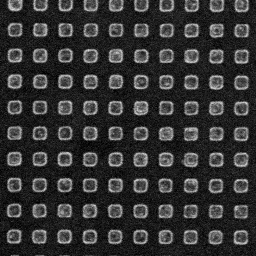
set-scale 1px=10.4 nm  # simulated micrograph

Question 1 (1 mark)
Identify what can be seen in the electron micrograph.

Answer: a regular array of raised bodies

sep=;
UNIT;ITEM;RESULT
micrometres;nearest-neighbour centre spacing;0.26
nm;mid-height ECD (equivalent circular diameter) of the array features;141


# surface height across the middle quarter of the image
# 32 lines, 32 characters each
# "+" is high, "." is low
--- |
................................
................................
................................
++...+++....++....+++...+++...++
++...+++....++....+++...+++...++
++...+++....++....+++...+++...++
................................
................................
................................
+.....++....++....++............
++...+++....++....+++...+++...++
++...+++...+++....+++...+++...++
................................
................................
................................
................................
++...+++....++....+++...+++...++
++...+++...+++....+++...+++...++
+....+++....++....++....+++...++
................................
................................
................................
+....+++....+...................
++...+++....++....+++...+++...++
++...+++...+++....+++...+++...++
................................
................................
................................
................................
++...+++...+++....+++...+++...++
++...+++...+++....++....+++...++
+....+++...+++....++....+++...++